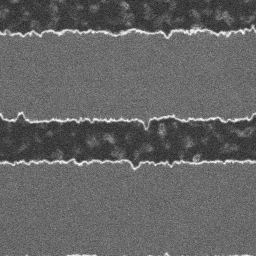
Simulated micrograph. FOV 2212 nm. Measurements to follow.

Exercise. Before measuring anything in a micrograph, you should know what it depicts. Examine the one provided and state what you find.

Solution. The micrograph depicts one or a few lines or trenches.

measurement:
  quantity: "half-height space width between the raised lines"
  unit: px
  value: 87.1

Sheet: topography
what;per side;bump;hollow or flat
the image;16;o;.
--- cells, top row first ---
oooooooooooooooo
oooooooooooooooo
................
................
................
................
................
oo..oo....oooo.o
oooooooooooooooo
oooooooooooooooo
................
................
................
................
................
................